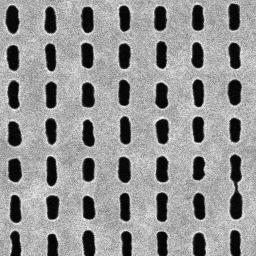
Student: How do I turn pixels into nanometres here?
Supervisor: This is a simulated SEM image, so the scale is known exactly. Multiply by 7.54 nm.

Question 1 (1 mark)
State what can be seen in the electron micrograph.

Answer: a regular array of holes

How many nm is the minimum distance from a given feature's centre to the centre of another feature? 273